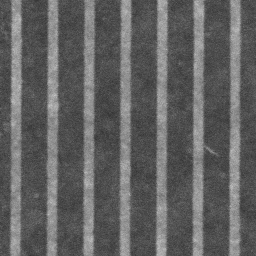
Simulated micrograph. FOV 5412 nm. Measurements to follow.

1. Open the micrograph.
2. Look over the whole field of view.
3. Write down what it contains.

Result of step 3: parallel lines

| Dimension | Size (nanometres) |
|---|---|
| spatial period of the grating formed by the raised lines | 771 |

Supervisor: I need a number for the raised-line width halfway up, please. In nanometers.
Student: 198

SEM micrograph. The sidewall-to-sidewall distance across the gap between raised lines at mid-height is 0.573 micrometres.